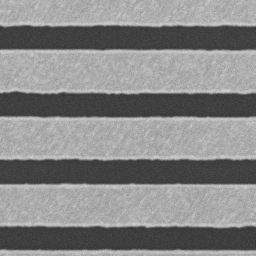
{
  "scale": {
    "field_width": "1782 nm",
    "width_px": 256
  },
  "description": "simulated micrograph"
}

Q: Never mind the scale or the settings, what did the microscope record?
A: lines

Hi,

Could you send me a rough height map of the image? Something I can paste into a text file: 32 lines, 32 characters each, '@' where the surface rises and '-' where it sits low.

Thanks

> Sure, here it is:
@@@@@@@@@@@@@@@@@@@@@@@@@@@@@@@@
@@@@@@@@@@@@@@@@@@@@@@@@@@@@@@@@
@@@@@@@@@@@@@@@@@@@@@@@@@@@@@@@@
--------------------------------
--------------------------------
--------------------------------
@@@@@@@@@@@@@@@@@@@@@@@@@@@@@@@@
@@@@@@@@@@@@@@@@@@@@@@@@@@@@@@@@
@@@@@@@@@@@@@@@@@@@@@@@@@@@@@@@@
@@@@@@@@@@@@@@@@@@@@@@@@@@@@@@@@
@@@@@@@@@@@@@@@@@@@@@@@@@@@@@@@@
@--@@@@@@@@@@@@@@@@@@@@@@@@@@@@@
--------------------------------
--------------------------------
--------------------------------
@@@@@@@@@@@@@@@@@@@@@@@@@@@@@@@@
@@@@@@@@@@@@@@@@@@@@@@@@@@@@@@@@
@@@@@@@@@@@@@@@@@@@@@@@@@@@@@@@@
@@@@@@@@@@@@@@@@@@@@@@@@@@@@@@@@
@@@@@@@@@@@@@@@@@@@@@@@@@@@@@@@@
--------------------------------
--------------------------------
--------------------------------
@@@@@@@@@@@@@@@@@@@@@@@@@@@@@@@@
@@@@@@@@@@@@@@@@@@@@@@@@@@@@@@@@
@@@@@@@@@@@@@@@@@@@@@@@@@@@@@@@@
@@@@@@@@@@@@@@@@@@@@@@@@@@@@@@@@
@@@@@@@@@@@@@@@@@@@@@@@@@@@@@@@@
--------------------------------
--------------------------------
--------------------------------
@@@@@@@@@@@@@@@@@@@@@@@@@@@@@@@@